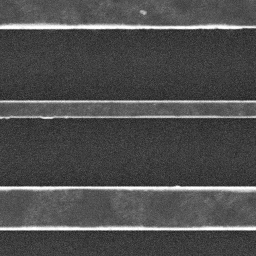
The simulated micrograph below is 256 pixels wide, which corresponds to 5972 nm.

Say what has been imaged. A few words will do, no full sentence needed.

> lines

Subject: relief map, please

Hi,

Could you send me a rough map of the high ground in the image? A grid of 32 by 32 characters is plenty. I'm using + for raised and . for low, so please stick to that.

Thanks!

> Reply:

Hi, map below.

++++++++++++++++++++++++++++++++
++++++++++++++++++++++++++++++++
++++++++++++++++++++++++++++++++
................................
................................
................................
................................
................................
................................
................................
................................
................................
................................
++++++++++++++++++++++++++++++++
++++++++++++++++++++++++++++++++
................................
................................
................................
................................
................................
................................
................................
................................
+++++++++++++++++++++++++++++...
++++++++++++++++++++++++++++++++
++++++++++++++++++++++++++++++++
++++++++++++++++++++++++++++++++
++++++++++++++++++++++++++++++++
++++++++++++++++++++++++++++++++
................................
................................
................................